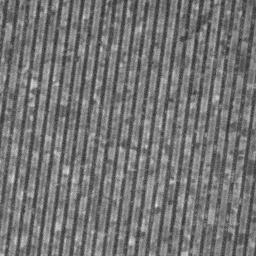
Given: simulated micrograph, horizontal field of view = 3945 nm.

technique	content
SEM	parallel lines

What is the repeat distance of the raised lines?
165 nanometres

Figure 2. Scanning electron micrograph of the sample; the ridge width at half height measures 82.1 nm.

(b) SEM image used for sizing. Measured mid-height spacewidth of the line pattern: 82.1 nm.